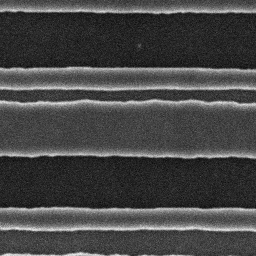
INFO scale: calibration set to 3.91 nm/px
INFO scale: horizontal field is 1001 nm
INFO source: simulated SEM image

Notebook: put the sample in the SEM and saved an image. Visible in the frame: lines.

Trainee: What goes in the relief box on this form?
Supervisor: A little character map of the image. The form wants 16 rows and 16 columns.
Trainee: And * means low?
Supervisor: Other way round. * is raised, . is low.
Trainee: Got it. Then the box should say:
****************
................
................
................
****************
****************
****************
****************
****************
****************
................
................
................
****************
****************
****************